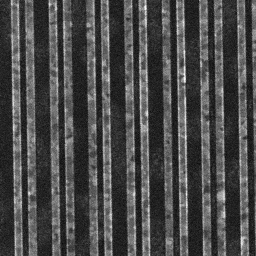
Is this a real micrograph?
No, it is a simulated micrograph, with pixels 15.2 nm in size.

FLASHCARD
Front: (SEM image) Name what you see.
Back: parallel lines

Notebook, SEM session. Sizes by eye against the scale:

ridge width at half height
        106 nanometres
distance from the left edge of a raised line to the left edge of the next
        287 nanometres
